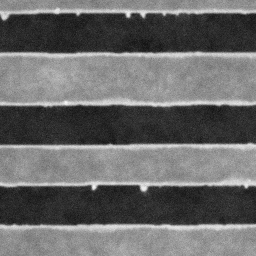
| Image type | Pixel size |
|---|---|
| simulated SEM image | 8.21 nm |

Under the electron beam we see lines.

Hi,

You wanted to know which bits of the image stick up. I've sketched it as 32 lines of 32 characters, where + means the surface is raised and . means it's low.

++++++++++++++++++++++++++++++++
++++++++++++++++++++++++++++++++
................................
................................
................................
................................
................................
++++++++++++++++++++++++++++++++
++++++++++++++++++++++++++++++++
++++++++++++++++++++++++++++++++
++++++++++++++++++++++++++++++++
++++++++++++++++++++++++++++++++
++++++++++++++++++++++++++++++++
................................
................................
................................
................................
................................
++++++++++++++++++++++++++++++++
++++++++++++++++++++++++++++++++
++++++++++++++++++++++++++++++++
++++++++++++++++++++++++++++++++
++++++++++++++++++++++++++++++++
................................
................................
................................
................................
................................
++++++++++++++++++++++++++++++++
++++++++++++++++++++++++++++++++
++++++++++++++++++++++++++++++++
++++++++++++++++++++++++++++++++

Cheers